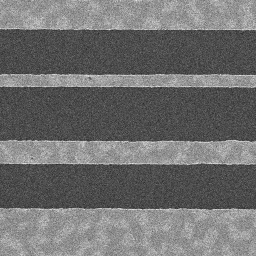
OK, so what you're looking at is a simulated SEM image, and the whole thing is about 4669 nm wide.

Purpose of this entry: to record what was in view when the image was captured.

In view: one or a few lines or trenches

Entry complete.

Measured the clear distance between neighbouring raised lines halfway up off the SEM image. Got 830 nm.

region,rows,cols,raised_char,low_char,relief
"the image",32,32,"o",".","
oooooooooooooooooooooooooooooooo
oooooooooooooooooooooooooooooooo
oooooooooooooooooooooooooooooooo
oooo.oooooooooooooo.oooooooooooo
................................
................................
................................
................................
................................
oooooooooo...ooooooooooo.ooooooo
o.ooooooooo.oooooooooooooooooooo
................................
................................
................................
................................
................................
................................
................................
oooooooooooooooooooooooooooooooo
oooooooooooooooooooooooooooooooo
......................oo........
................................
................................
................................
................................
................................
oooooooooooooooooooooooooooooooo
oooooooooooooooooooooooooooooooo
oooooooooooooooooooooooooooooooo
oooooooooooooooooooooooooo.ooooo
ooooooooooooooooooooooooo.oooooo
oooooooooooooooooooooooooooooooo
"